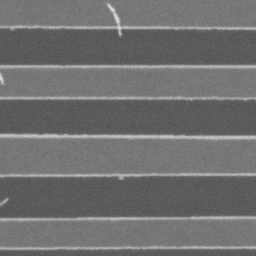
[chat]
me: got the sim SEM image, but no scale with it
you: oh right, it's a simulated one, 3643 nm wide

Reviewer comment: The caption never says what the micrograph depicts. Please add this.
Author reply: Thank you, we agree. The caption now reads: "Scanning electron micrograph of lines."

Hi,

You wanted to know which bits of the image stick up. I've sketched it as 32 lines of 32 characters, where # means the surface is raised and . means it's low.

################################
################################
################################
........########################
................................
................................
................................
................................
################################
################################
################################
################################
................................
................................
................................
................................
................................
################################
################################
################################
################################
################################
................................
................................
................................
................................
................................
################################
################################
################################
################################
................................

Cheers